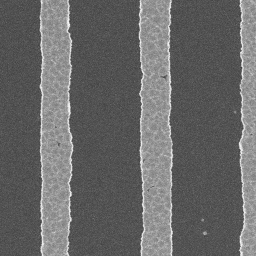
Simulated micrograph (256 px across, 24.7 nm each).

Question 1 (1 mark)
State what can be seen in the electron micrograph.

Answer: one or a few lines or trenches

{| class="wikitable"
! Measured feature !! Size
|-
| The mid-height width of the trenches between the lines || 1.76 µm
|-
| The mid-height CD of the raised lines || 0.703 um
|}